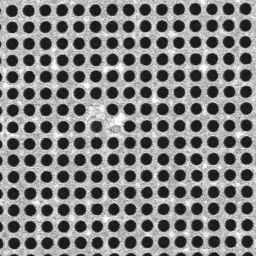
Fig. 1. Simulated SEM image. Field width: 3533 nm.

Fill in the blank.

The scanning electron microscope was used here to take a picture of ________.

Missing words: a regular array of holes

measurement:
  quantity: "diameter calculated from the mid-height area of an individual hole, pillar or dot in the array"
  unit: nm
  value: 166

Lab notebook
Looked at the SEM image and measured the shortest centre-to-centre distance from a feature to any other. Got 0.227 microns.